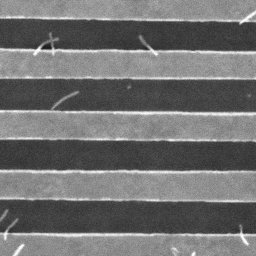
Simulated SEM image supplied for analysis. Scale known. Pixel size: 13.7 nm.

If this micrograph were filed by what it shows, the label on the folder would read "lines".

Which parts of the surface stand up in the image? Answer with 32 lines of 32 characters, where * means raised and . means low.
********************************
********************************
.................***************
................................
................................
................................
********************************
********************************
********************************
********************************
................................
................................
................................
................................
********************************
********************************
********************************
.................***.***********
................................
................................
................................
**********************..****.***
********************************
********************************
********************************
................................
................................
................................
................................
********************************
********************************
********************************